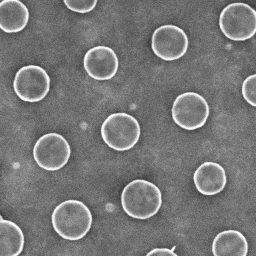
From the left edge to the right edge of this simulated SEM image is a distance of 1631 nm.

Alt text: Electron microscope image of a regular array of raised bodies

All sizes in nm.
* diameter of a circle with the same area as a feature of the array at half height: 228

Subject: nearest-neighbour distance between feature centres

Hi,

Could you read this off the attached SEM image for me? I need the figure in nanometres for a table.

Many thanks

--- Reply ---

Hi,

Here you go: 452